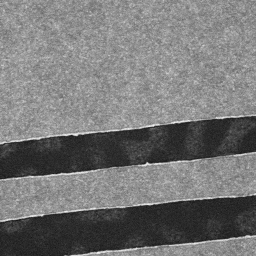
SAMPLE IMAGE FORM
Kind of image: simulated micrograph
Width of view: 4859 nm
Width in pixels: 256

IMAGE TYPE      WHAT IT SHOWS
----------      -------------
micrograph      one or a few lines or trenches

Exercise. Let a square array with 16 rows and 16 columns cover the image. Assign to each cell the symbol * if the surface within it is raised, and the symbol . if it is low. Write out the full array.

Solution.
****************
****************
****************
****************
****************
****************
****************
*************...
***.............
................
.......*********
****************
************....
**..............
................
.........*******